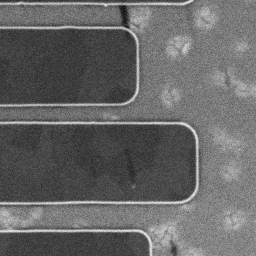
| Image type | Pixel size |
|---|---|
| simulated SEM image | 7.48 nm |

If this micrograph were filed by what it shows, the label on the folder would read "one or a few lines or trenches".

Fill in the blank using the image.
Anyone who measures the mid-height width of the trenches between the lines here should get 180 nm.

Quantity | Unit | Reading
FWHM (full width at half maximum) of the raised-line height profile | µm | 0.592